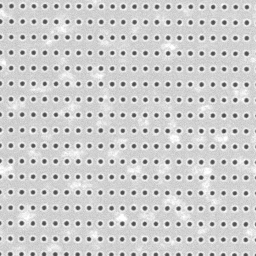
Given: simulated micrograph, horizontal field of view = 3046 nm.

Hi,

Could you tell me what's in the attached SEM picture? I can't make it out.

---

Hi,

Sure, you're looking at a regular array of holes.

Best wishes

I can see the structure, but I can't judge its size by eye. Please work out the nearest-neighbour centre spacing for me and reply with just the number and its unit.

130 nanometers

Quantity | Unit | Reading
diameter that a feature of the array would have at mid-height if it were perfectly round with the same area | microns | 0.0601